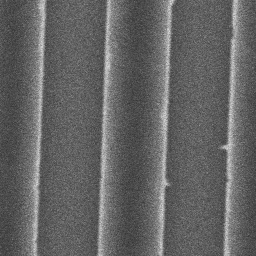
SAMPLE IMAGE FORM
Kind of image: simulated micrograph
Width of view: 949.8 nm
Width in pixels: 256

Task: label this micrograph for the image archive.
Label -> one or a few lines or trenches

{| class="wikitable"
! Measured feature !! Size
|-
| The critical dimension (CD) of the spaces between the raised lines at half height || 234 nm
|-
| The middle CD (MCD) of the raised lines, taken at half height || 231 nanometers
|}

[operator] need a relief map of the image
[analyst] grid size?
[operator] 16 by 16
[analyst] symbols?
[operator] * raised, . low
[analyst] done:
***....****....*
***....****....*
***....****....*
***....****...**
***....****...**
***....***....**
***....***....**
***....***....**
**....****....**
**....****....**
**....****....**
**....****....**
**....****....**
**....****....**
**....****....**
**....****....**